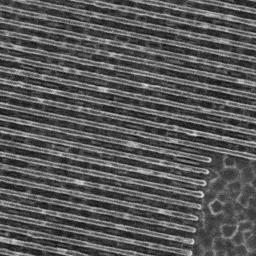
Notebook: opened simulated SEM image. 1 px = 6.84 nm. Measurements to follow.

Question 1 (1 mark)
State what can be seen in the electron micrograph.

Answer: parallel lines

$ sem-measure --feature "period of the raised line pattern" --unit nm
81.5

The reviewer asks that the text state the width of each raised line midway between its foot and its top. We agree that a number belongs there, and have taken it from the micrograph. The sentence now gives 29.3 nm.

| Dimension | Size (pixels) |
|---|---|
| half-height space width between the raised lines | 7.59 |